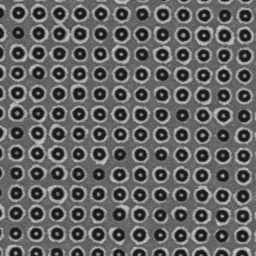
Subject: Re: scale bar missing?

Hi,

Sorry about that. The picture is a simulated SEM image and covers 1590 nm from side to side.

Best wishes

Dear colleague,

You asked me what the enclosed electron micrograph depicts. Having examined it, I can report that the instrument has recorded a regular array of ring-shaped grooves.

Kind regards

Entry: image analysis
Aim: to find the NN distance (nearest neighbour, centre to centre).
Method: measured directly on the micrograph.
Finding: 122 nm